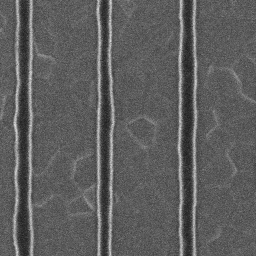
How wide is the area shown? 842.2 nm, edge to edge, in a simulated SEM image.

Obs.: one or a few lines or trenches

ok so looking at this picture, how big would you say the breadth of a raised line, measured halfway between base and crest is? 47.6 nanometers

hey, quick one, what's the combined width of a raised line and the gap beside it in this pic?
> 81.9 px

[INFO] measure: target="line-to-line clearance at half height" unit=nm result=224